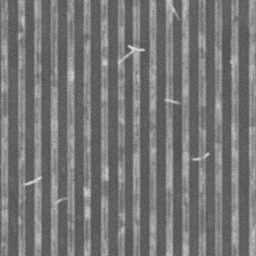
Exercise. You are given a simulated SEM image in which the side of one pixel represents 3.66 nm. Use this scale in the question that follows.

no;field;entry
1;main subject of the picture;parallel lines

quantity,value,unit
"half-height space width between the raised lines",11.4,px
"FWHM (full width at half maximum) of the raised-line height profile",5.74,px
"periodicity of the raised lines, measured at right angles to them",60.2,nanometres